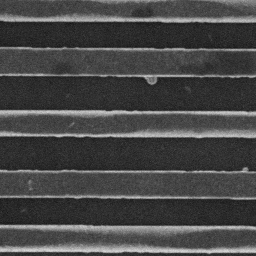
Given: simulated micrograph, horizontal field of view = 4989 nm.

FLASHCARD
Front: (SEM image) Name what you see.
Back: lines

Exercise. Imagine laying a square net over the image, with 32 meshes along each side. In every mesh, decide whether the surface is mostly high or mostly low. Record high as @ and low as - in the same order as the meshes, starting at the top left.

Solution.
@@@@@@@@@@@@@@@@@@@@@@@@@@@@@@@@
@@@@@@@@@@@@@@@@@@@@@@@@@@@@@@@@
--@@@@@@---@@@@@@@@@@@@@@@@@@@@@
--------------------------------
--------------------------------
--------------------------------
@@@@@@@@@@@@@@@@@@@@@@@@@@@@@@@@
@@@@@@@@@@@@@@@@@@@@@@@@@@@@@@@@
@@@@@@@@@@@@@@@@@@@@@@@@@@@@@@@@
------------@@@@@@@@@@@@@@@@@@@@
--------------------------------
--------------------------------
--------------------------------
--------------------------------
@@@@@@@@@@@@@@@@@@@@@@@@@@@@@@@@
@@@@@@@@@@@@@@@@@@@@@@@@@@@@@@@@
@@@@@@@@@@@@@@@@@@@@@@@@@@@@@@@@
--------------------------------
--------------------------------
--------------------------------
--------------------------------
@@@@@@@@@@@@@@@@@@@@@@@@@@@@--@-
@@@@@@@@@@@@@@@@@@@@@@@@@@@@@@@@
@@@@@@@@@@@@@@@@@@@@@@@@@@@@@@@@
@@@@@@@@@@@@@@@@@@@@@@@@@@@@@@@@
--------------------------------
--------------------------------
--------------------------------
@@@@@@@@@@@@@@----------@@@@@@@@
@@@@@@@@@@@@@@@@@@@@@@@@@@@@@@@@
@@@@@@@@@@@@@@@@@@@@@@@@@@@@@@@@
-------------------------@@-----